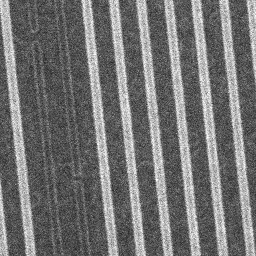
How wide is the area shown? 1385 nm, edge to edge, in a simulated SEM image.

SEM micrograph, parallel lines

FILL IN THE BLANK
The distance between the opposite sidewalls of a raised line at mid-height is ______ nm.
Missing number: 41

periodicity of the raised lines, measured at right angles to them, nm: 148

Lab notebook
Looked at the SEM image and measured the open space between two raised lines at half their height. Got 0.105 µm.